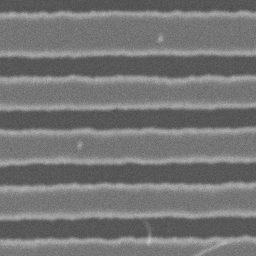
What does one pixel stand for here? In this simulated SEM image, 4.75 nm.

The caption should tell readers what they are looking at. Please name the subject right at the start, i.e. lines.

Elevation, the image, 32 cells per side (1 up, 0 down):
00000000000000000000000000000000
00000001100111111111011010111111
11111111111111111111111111111111
11111111111111111111111111111111
11111111111111111111111111111111
11111111111111111111111111111111
11111111111111111111111111111111
00000000000000000000000000000000
00000000000000000000000000000000
00000000010000000000000000000000
11111111111111111111111111111111
11111111111111111111111111111111
11111111111111111111111111111111
11111111111111111111011111111110
00000000000000000000000000000000
00000000000000000000000000000000
11111111111111111111111111111111
11111111111111111111111111111111
11111111111111111111111111111111
11111111111111111111111111111111
11110010011111100011000000000000
00000000000000000000000000000000
00000000000000000000000000000000
11111111111111111111111111111111
11111111111111111111111111111111
11111111111111111111111111111111
11111111111111111111111111111111
11000000000000000000000000000000
00000000000000000000000000000000
00000000000000000000000000000000
11111111111111111111111111111111
11111111111111111111111111111111